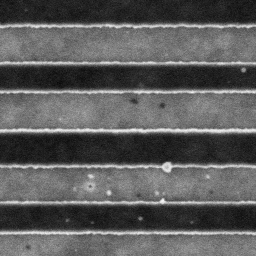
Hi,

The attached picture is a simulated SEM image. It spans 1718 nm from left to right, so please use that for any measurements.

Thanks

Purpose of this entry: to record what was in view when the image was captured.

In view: lines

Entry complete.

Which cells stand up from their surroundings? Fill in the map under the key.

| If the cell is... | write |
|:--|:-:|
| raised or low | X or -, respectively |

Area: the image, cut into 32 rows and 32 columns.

XXXXXXXXXXXXXXXXXXXXXXXXXXXXXXXX
XXXXXXXXXXXXXXXXXXXXXXXXXXXXXXXX
XXXXXXXXXXXXXXXXXXXXXXXXXXXXXXXX
--------------------------------
--------------------------------
--------------------------------
--------------------------------
--------------------------------
XXXXXXXXXXXXXXXXXXXXXXXXXXXXXXXX
XXXXXXXXXXXXXXXXXXXXXXXXXXXXXXXX
XXXXXXXXXXXXXXXXXXXXXXXXXXXXXXXX
XXXXXXXX-XXXX-XX-XXXXXXXXXXXXXXX
--------------------------------
--------------------------------
--------------------------------
--------------------------------
XXXXXXXXXXXXXXXXXXXXXXXXXXXXXXXX
XXXXXXXXXXXXXXXXXXXXXXXXXXXXXXXX
XXXXXXXXXXXXXXXXXXXXXXXXXXXXXXXX
XXXXXXXXXXXXXXXXXXXXXXXXXXXXXXXX
XXXXXXXXXXXXXXXXXXXXXXXXXXXXXXXX
--------------------------------
--------------------------------
--------------------------------
--------------------------------
XXXXXXXXXXXXXXXXXXXXXXXXXXXXXXXX
XXXXXXXXXXXXXXXXXXXXXXXXXXXXXXXX
XXXXXXXXXXXXXXXXXXXXXXXXXXXXXXXX
XXXXXXXXXXXXXXXXXXXXXXXXXXXXXXXX
--------------------------------
--------------------------------
--------------------------------